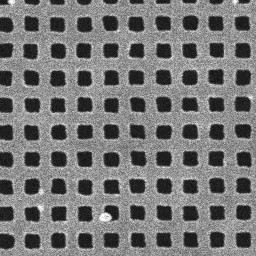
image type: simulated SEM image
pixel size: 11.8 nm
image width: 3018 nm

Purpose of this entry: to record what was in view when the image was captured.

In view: a regular array of holes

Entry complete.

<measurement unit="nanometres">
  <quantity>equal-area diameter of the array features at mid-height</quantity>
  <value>199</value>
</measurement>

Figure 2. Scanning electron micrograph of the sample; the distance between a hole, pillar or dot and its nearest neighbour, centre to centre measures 0.307 um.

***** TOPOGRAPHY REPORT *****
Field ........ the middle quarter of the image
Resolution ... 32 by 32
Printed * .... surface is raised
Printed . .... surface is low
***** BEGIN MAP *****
********************************
****.******.*****.*************.
***....***....**....***....**...
***....***....**....***....**...
***....***....**....***....**...
****...****..************.******
********************************
********************************
***...*****..****..****....***..
***....***....**....***....**...
***....***....***....**....**...
***....***....***....**....***..
********************************
********************************
********************************
***....***...***....***....***..
***....***....**....***....***..
.**....***....**....***....***..
.**....***....***...***....***..
********************************
********************************
********************************
***....***...***....***....***..
.**....***....***...***....***..
.**....***....***....**....***..
****...***....*****.****..****..
********************************
********************************
********************************
****...***....**....***....***..
.**....***....**....***....***..
.**....***....**....***....***..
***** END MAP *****